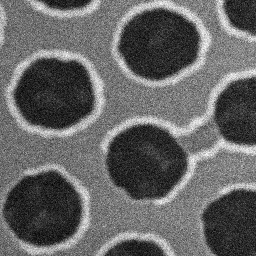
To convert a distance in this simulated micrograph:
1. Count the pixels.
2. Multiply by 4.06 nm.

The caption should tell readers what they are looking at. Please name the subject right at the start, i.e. holes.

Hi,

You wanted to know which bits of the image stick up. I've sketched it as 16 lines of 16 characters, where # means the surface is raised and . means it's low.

###..#########..
########....##..
#######.....####
########....####
##...###...#####
#.....########..
#.....#######...
##...########...
#######.........
#######.....####
#######.....####
#...###....#####
.....########...
.....########...
#....########...
#######...###...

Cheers